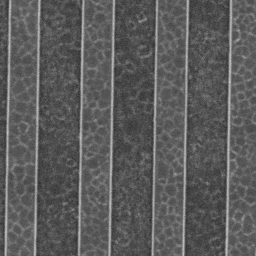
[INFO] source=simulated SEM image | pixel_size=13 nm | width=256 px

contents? one or a few lines or trenches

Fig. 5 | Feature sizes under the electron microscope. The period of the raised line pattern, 962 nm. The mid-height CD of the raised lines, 0.401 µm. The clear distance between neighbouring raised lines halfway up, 569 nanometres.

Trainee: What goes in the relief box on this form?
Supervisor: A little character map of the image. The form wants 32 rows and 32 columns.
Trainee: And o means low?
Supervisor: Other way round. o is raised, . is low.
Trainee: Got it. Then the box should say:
.oooo.....oooo......ooo......ooo
.oooo.....oooo......ooo......ooo
.oooo.....oooo......ooo......ooo
.oooo.....oooo......ooo......ooo
.oooo.....oooo......ooo......ooo
.oooo.....oooo......ooo......ooo
.oooo.....oooo......ooo......ooo
.oooo.....oooo......ooo......ooo
.oooo.....oooo.....oooo......ooo
.oooo.....oooo.....oooo......ooo
.oooo.....oooo.....oooo......ooo
.oooo.....oooo.....oooo......ooo
.oooo.....oooo.....oooo......ooo
.oooo.....oooo.....oooo......ooo
.oooo.....oooo.....oooo......ooo
.oooo.....oooo.....oooo......ooo
.oooo.....oooo.....oooo......ooo
.oooo.....oooo.....oooo......ooo
.oooo.....oooo.....oooo......ooo
.oooo.....oooo.....oooo......ooo
.oooo.....oooo.....oooo......ooo
.ooo......oooo.....oooo......ooo
.ooo......oooo.....oooo......ooo
.ooo......oooo.....oooo......ooo
.ooo......oooo.....oooo......ooo
.ooo......oooo.....oooo......ooo
.ooo......oooo.....oooo.....oooo
.ooo......oooo.....oooo.....oooo
.ooo......oooo.....oooo.....oooo
.ooo......oooo.....oooo.....oooo
.ooo......oooo.....oooo.....oooo
.ooo......oooo.....oooo.....oooo